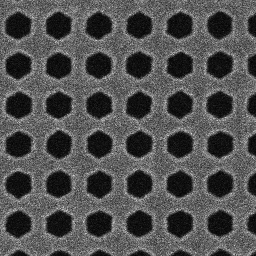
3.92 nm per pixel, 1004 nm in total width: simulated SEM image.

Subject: a regular array of holes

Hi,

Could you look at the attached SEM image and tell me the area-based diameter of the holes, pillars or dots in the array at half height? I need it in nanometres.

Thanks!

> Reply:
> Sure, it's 103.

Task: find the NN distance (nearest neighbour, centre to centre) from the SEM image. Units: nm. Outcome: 155